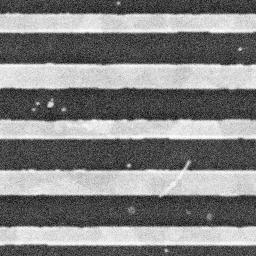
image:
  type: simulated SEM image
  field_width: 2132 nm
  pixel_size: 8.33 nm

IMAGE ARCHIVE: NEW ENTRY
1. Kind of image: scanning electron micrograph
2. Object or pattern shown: lines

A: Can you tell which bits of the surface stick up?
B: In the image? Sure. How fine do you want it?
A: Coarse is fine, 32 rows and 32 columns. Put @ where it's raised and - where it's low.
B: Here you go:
--------------------------------
--------------------------------
@@@@@@@@@@@@@@@@@@@@@@@@@@@@@@@@
@@@@@@@@@@@@@@@@@@@@@@@@@@@@@@@@
--------------------------------
--------------------------------
--------------------------------
--------------------------------
@@@@@@@@@@@@@@@@@@@@@@@@@@@@@@@@
@@@@@@@@@@@@@@@@@@@@@@@@@@@@@@@@
@@@@@@@@@@@@@@@@@@@@@@@@@@@@@@@@
--------------------------------
--------------------------------
--------------------------------
--------------------------------
@@@@@@@@@@@@@@@@@@@@@@@@@@@@@@@@
@@@@@@@@@@@@@@@@@@@@@@@@@@@@@@@@
--------------------------------
--------------------------------
--------------------------------
--------------------------------
@@@@@@@@@@@@@@@@@@@@@@@@@@@@@@@@
@@@@@@@@@@@@@@@@@@@@@@@@@@@@@@@@
@@@@@@@@@@@@@@@@@@@@@@@@@@@@@@@@
--------------------------------
--------------------------------
--------------------------------
--------------------------------
@@@@@@@@@@@@@@@@@@@@@@@@@@@@@@@@
@@@@@@@@@@@@@@@@@@@@@@@@@@@@@@@@
----------------------------@--@
--------------------------------